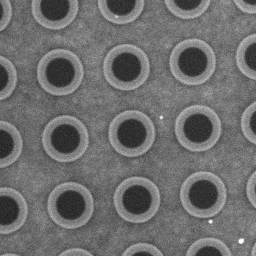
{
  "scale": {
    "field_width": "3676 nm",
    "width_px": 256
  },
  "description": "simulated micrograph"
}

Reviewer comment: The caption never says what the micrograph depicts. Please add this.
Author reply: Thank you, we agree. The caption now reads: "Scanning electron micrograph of an array of small figures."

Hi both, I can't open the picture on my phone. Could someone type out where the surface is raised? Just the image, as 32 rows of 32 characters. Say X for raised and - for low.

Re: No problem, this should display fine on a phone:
X---XXXXXX--XXXXXX---XXXXX----XX
X---XXXXXX---XXXXX---XXXX------X
X----XXXX-----XXX---------------
X-----XX------------------------
-------------------------------X
----------------------XXXX----XX
------XXX-----XXXX----XXXXX---XX
X----XXXXX---XXXXXX--XXXXXX---XX
XX---XXXXX---XXXXXX--XXXXXX---XX
XX---XXXXX---XXXXX----XXXX-----X
XX---XXXXX----XXXX-----XX-------
X-----XXX-----------------------
--------------------------------
-----------------------XXX-----X
--------X------XXX----XXXXX---XX
X-----XXXX----XXXXX---XXXXXX--XX
XX---XXXXXX---XXXXX---XXXXXX--XX
XXX--XXXXXX---XXXXX---XXXXX----X
XXX---XXXXX---XXXXX----XXX------
XX----XXXX------X---------------
X-------------------------------
-------------------------X------
----------------XXX----XXXXX---X
X------XXXX----XXXXX---XXXXX---X
XXX---XXXXX---XXXXXX---XXXXX---X
XXX---XXXXXX--XXXXXX---XXXXX----
XXX---XXXXXX---XXXX-----XXX-----
XXX----XXXX-----XX--------------
XX------X-----------------------
--------------------------------
-----------------XX-----XXXX----
--------XXX-----XXXX---XXXXXX--X